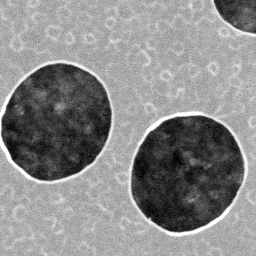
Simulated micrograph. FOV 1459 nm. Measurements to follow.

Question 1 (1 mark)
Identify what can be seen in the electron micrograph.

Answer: holes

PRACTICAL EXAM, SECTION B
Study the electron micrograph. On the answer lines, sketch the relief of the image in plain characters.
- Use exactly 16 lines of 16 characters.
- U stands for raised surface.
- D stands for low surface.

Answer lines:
UUUUUUUUUUUUUDDD
UUUUUUUUUUUUUUDD
UUUUUUUUUUUUUUUU
UUUUUUUUUUUUUUUU
UUDDDDUUUUUUUUUU
UDDDDDDUUUUUUUUU
DDDDDDDUUUUUUUUU
DDDDDDDUUUDDDUUU
DDDDDDDUUDDDDDDU
DDDDDDUUUDDDDDDU
UDDDDUUUDDDDDDDU
UUUUUUUUDDDDDDDU
UUUUUUUUDDDDDDDU
UUUUUUUUUDDDDDUU
UUUUUUUUUUUDUUUU
UUUUUUUUUUUUUUUU